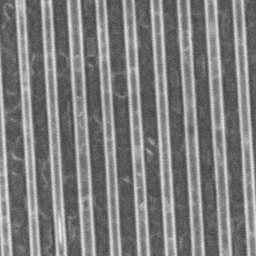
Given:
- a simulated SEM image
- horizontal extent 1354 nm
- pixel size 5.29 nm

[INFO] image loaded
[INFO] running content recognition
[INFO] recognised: parallel lines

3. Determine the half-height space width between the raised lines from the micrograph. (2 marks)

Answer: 91.7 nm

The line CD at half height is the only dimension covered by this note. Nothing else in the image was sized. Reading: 50.8 nm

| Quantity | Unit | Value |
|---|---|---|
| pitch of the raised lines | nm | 144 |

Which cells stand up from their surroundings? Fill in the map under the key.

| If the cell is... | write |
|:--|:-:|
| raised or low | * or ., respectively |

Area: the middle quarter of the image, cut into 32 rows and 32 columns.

..***....**.....**.....**.....**
..***....**.....**.....**.....**
..***....**.....**.....**.....**
..***....**.....**.....**.....**
..***....**.....**.....**.....**
..***.....**....**.....**.....**
..***.....**....***....***....**
..***.....**....***....***....**
...**.....**....***....***....**
...**.....**.....**....***....**
...**.....**.....**.....**....**
...**.....**.....**.....**....**
...**.....**.....**.....**....**
...***....**.....**.....**....**
...***....**.....**.....**.....*
...***....**.....**.....**.....*
...***....**.....**.....**.....*
...***....**.....**.....**.....*
...***....**.....**.....**.....*
...***....**.....**.....**.....*
...***....**.....**.....**.....*
...***.....*.....**.....**.....*
...***.....**....**.....**.....*
...***.....**....***....***....*
...***.....**....***....***....*
....**.....**....***....***....*
....**.....**.....**....***....*
....**.....**.....**.....**....*
....**.....**.....**.....**....*
....**.....**.....**.....**....*
....***....**.....**.....**....*
....***....**.....**.....**.....